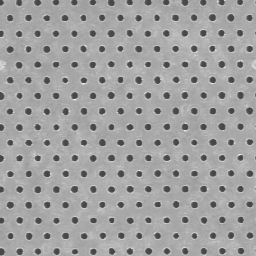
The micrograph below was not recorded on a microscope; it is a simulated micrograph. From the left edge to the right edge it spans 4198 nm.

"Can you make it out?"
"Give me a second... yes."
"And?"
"a regular array of holes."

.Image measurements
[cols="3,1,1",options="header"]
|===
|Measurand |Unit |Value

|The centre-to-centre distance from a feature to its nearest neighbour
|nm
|292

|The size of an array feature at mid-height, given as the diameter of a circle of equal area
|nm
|106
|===